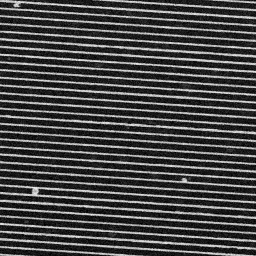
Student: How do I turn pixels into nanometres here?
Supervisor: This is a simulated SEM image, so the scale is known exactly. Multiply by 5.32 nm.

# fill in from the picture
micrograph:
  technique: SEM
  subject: parallel lines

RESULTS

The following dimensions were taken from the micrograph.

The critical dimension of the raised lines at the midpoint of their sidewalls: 8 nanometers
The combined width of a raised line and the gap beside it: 40.8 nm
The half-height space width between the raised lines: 0.0331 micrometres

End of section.